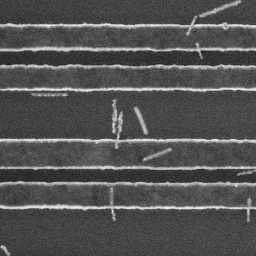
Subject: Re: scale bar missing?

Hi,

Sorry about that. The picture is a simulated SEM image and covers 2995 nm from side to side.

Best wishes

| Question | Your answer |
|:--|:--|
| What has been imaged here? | lines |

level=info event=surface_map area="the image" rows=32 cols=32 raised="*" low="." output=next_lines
................................
................................
................................
********************************
********************************
********************************
................................
................................
********************************
********************************
********************************
................................
................................
................................
................................
................................
................................
***********.***..***.*******.*..
********************************
********************************
********************************
................................
................................
********************************
********************************
********************************
................................
................................
................................
................................
................................
................................